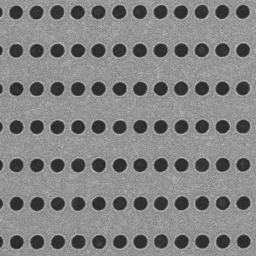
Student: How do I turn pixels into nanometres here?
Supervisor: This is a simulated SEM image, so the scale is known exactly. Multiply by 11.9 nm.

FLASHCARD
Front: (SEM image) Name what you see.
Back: a regular array of holes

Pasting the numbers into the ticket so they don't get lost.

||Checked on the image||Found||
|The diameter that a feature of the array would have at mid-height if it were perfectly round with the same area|173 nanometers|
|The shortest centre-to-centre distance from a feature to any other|0.244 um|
